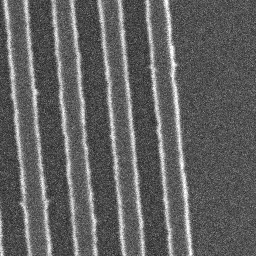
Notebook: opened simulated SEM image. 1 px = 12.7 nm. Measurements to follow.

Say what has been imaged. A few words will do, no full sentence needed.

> parallel lines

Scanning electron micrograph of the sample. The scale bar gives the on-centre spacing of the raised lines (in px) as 46.9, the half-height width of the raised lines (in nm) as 250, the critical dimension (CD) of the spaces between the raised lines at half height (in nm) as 347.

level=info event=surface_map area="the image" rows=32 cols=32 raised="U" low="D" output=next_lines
DUUDDDDUUDDDUUUDDDUUUDDDDDDDDDDD
DUUDDDDUUDDDDUUDDDUUUDDDDDDDDDDD
DUUDDDDUUDDDDUUDDDUUUDDDDDDDDDDD
DUUUDDDUUDDDDUUDDDDUUDDDDDDDDDDD
DUUUDDDUUUDDDUUDDDDUUDDDDDDDDDDD
DUUUDDDUUUDDDUUDDDDUUDDDDDDDDDDD
DUUUDDDUUUDDDUUUDDDUUDDDDDDDDDDD
DUUUDDDUUUDDDUUUDDDUUUDDDDDDDDDD
DUUUDDDUUUDDDUUUDDDUUUDDDDDDDDDD
DDUUDDDUUUDDDUUUDDDUUUDDDDDDDDDD
DDUUDDDDUUDDDDUUDDDUUUDDDDDDDDDD
DDUUDDDDUUDDDDUUDDDUUUDDDDDDDDDD
DDUUDDDDUUDDDDUUDDDUUUDDDDDDDDDD
DDUUDDDDUUDDDDUUDDDDUUDDDDDDDDDD
DDUUUDDDUUDDDDUUDDDDUUDDDDDDDDDD
DDUUUDDDUUDDDDUUDDDDUUDDDDDDDDDD
DDUUUDDDUUUDDDUUUDDDUUDDDDDDDDDD
DDUUUDDDUUUDDDUUUDDDUUDDDDDDDDDD
DDUUUDDDUUUDDDUUUDDDUUUDDDDDDDDD
DDUUUDDDUUUDDDUUUDDDUUUDDDDDDDDD
DDDUUDDDDUUDDDUUUDDDUUUDDDDDDDDD
DDDUUDDDDUUDDDDUUDDDUUUDDDDDDDDD
DDDUUDDDDUUDDDDUUDDDUUUDDDDDDDDD
DDDUUDDDDUUDDDDUUDDDDUUDDDDDDDDD
DDDUUUDDDUUDDDDUUDDDDUUDDDDDDDDD
DDDUUUDDDUUDDDDUUDDDDUUDDDDDDDDD
DDDUUUDDDUUUDDDUUDDDDUUDDDDDDDDD
DDDUUUDDDUUUDDDUUUDDDUUDDDDDDDDD
DDDUUUDDDUUUDDDUUUDDDUUUDDDDDDDD
DDDUUUDDDUUUDDDUUUDDDUUUDDDDDDDD
DDDDUUDDDUUUDDDUUUDDDUUUDDDDDDDD
DDDDUUDDDDUUDDDUUUDDDUUUDDDDDDDD